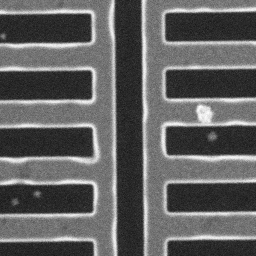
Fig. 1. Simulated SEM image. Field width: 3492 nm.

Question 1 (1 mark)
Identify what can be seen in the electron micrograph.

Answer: groups of lines, slits or small figures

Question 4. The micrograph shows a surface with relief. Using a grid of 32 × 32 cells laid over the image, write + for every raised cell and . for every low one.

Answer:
++++++++++++++....++++++++++++++
++++++++++++++....+++...........
............++....++............
............++....++............
............++....++............
.........+++++....++++++++++++++
++++++++++++++....++++++++++++++
++++++++++++++....++++++++++++++
++++++++++++++....++++++++++++++
............++....+++...........
............++....+++...........
............++....+++...........
...........+++....++++++++++++++
++++++++++++++....++++++++++++++
++++++++++++++....++++++++++++++
++++++++++++++....+++++++++++..+
............++....++............
............++....++............
............++....+++...........
............++....+++...........
++++++++++++++....++++++++++++++
++++++++++++++....++++++++++++++
++++++++++++++....++++++++++++++
............++....+++...........
............++....+++...........
............++....+++...........
............++....+++...........
++++++++++++++....++++++++++++++
++++++++++++++....++++++++++++++
++++++++++++++....++++++++++++++
............++....+++...........
............++....+++...........